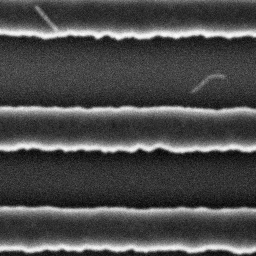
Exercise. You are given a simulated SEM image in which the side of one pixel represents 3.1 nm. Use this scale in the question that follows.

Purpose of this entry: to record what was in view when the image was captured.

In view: lines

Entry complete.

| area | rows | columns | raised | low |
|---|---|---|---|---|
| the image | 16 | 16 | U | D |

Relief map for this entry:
UUUUUUUUUUUUUUUU
UUUUUUUUUUUUUUUU
DDDDDDDDDDDDDDDD
DDDDDDDDDDDDDDDD
DDDDDDDDDDDDDDDD
DDDDDDDDDDDDDDDD
DDDDDDDDDDDDDDDD
UUUUUUUUUUUUUUUU
UUUUUUUUUUUUUUUU
DDDDDDDDDDDDDDDD
DDDDDDDDDDDDDDDD
DDDDDDDDDDDDDDDD
DDDDDDDDDDDDDDDD
UUUUUUUUUUUUUUUU
UUUUUUUUUUUUUUUU
UUUUUUUUUUUUUUUU